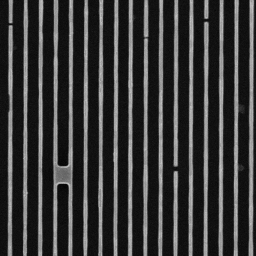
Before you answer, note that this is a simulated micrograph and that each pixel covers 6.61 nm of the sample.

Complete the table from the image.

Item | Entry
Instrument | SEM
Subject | parallel lines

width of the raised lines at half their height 19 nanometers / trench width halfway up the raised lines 11.7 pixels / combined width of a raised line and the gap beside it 15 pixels